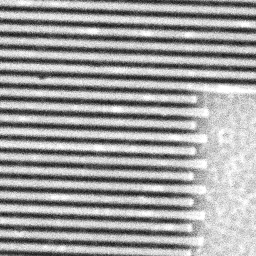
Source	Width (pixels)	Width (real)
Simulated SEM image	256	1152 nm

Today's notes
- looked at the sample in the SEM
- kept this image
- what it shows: parallel lines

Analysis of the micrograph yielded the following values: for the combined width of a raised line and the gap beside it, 0.0579 micrometres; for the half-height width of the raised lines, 27 nanometres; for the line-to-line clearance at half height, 31.5 nm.